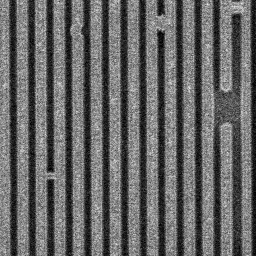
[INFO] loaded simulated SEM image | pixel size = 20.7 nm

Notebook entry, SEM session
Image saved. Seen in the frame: parallel lines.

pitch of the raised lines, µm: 0.387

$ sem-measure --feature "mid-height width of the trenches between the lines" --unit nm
158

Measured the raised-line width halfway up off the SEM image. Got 220 nm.